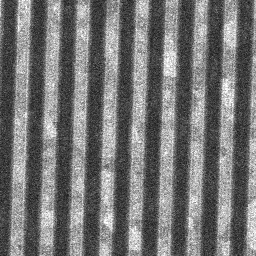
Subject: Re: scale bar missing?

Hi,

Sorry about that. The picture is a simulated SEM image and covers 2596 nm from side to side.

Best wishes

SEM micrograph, parallel lines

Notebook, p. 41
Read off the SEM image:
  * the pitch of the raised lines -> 299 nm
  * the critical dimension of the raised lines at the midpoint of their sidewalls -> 143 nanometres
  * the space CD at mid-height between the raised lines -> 152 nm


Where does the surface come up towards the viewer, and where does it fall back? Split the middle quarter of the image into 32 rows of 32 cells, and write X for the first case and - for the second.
---XXX----XXX----XXXX----XXX----
---XXX----XXX----XXXX----XXX----
---XXX----XXX----XXXX----XXX----
---XXX----XXX----XXXX----XXX----
--XXXX----XXX----XXXX----XXX----
--XXXX----XXX----XXXX----XXX----
--XXXX----XXX----XXX----XXXX----
--XXXX----XXX----XXX-----XXX----
--XXXX----XXX----XXXX----XXX----
--XXXX----XXX----XXXX----XXX----
--XXXX----XXX----XXXX---XXXX----
--XXXX----XXX----XXX-----XXX----
--XXXX----XXX----XXX----XXXX----
--XXXX----XXX----XXX----XXXX----
--XXXX----XXX----XXX----XXXX----
--XXXX----XXX----XXX----XXXX----
--XXXX----XXX----XXX----XXXX----
--XXXX----XXX----XXX----XXXX----
--XXXX----XXX----XXX----XXXX----
--XXXX----XXX----XXX----XXXX----
--XXXX---XXXX----XXX----XXXX----
--XXX----XXXX----XXX----XXXX----
--XXX----XXXX----XXX----XXX----X
--XXX----XXXX----XXX----XXX----X
--XXX----XXXX----XXX----XXX----X
--XXX----XXXX----XXX----XXX----X
--XXX----XXXX----XXX----XXX----X
--XXX----XXXX----XXX----XXX----X
--XXX----XXXX----XXX----XXX----X
--XXX----XXX----XXXX----XXX----X
--XXX----XXX----XXXX----XXX----X
--XXX----XXX----XXXX----XXX----X